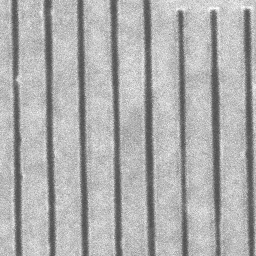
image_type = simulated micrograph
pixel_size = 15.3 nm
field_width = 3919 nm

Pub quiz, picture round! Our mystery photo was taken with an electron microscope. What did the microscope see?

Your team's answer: parallel lines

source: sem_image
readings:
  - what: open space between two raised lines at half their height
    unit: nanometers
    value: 360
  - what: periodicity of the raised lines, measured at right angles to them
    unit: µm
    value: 0.508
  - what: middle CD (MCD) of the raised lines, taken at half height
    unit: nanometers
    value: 153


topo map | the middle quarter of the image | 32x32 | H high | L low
LLLHHHLLLLLLHHLLLLLLHHLLLLLLHHHL
LLLHHHLLLLLLHHLLLLLLHHLLLLLLHHHL
LLLHHHLLLLLLHHLLLLLLHHLLLLLLHHHL
LLLHHHLLLLLLHHLLLLLLHHLLLLLLHHHL
LLLHHHLLLLLLHHLLLLLLHHLLLLLLHHHL
LLLHHHLLLLLLHHLLLLLLHHLLLLLLHHHL
LLLHHHLLLLLLHHLLLLLLHHLLLLLLLHHL
LLLHHHLLLLLLHHLLLLLLHHLLLLLLLHHL
LLLHHHLLLLLLHHLLLLLLHHLLLLLLLHHL
LLLHHHLLLLLLHHLLLLLLHHLLLLLLLHHL
LLLHHHLLLLLLHHLLLLLLHHLLLLLLLHHL
LLLHHHLLLLLLHHLLLLLLHHLLLLLLLHHL
LLLLHHLLLLLLHHLLLLLLHHHLLLLLLHHL
LLLLHHLLLLLLHHLLLLLLHHHLLLLLLHHL
LLLLHHLLLLLLHHLLLLLLHHHLLLLLLHHL
LLLLHHLLLLLLHHLLLLLLHHHLLLLLLHHL
LLLLHHLLLLLLHHLLLLLLHHHLLLLLLHHL
LLLLHHLLLLLLHHLLLLLLHHHLLLLLLHHL
LLLLHHLLLLLLHHLLLLLLHHHLLLLLLHHL
LLLLHHLLLLLLHHLLLLLLHHHLLLLLLHHL
LLLLHHLLLLLLHHLLLLLLHHHLLLLLLHHL
LLLLHHLLLLLLHHLLLLLLHHHLLLLLLHHL
LLLLHHLLLLLLHHLLLLLLHHHLLLLLLHHL
LLLLHHLLLLLLHHLLLLLLHHHLLLLLLHHL
LLLLHHLLLLLLHHLLLLLLHHHLLLLLLHHL
LLLLHHLLLLLLHHLLLLLLHHHLLLLLLHHL
LLLLHHLLLLLLHHLLLLLLHHHLLLLLLHHL
LLLLHHLLLLLLHHLLLLLLHHHLLLLLLHHL
LLLLHHLLLLLLHHLLLLLLHHHLLLLLLHHL
LLLLHHLLLLLLHHLLLLLLHHHLLLLLLHHL
LLLLHHLLLLLLHHLLLLLLHHHLLLLLLHHL
LLLLHHLLLLLLHHLLLLLLHHHLLLLLLHHL